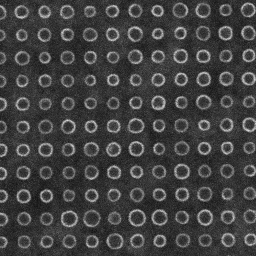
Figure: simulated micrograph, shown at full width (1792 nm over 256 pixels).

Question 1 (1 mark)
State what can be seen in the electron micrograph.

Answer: a regular array of raised bodies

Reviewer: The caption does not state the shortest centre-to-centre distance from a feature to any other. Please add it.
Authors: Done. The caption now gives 157 nm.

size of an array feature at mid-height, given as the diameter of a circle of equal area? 12.7 pixels